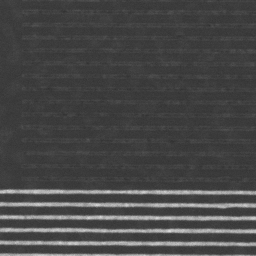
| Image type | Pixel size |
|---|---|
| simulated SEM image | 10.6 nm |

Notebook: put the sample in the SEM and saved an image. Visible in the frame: parallel lines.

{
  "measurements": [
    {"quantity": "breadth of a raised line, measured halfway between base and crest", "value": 33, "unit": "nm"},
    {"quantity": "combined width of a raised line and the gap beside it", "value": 136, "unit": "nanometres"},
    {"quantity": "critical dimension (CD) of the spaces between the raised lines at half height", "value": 0.103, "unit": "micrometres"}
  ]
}